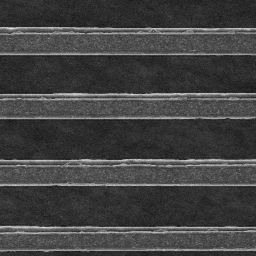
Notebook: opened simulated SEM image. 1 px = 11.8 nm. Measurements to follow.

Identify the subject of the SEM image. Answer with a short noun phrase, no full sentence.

lines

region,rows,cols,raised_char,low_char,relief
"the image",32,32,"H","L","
LLLLLLLLLLLLLLLLLLLLLLLLLLLLLLLL
LLLLLLLLLLLLLLLLLLLLLLLLLLLLLLLL
LLLLLLLLLLLLLLLLLLLLLLLLLLLLLLLL
HLHHHHHHHHLLLLLLLLLLLLLLLLLLLLLL
HHHHHHHHHHHHHHHHHHHHHHHHHHHHHHHH
HHHHHHHHHHHHHHHHHHHHHHHHHHHHHHHH
HHHHHHHHHHHHHHHHHHHHHHHHHHHHHHHH
LLLLLLLLLLLLLLLLLLLLLLLLLLLLLLLL
LLLLLLLLLLLLLLLLLLLLLLLLLLLLLLLL
LLLLLLLLLLLLLLLLLLLLLLLLLLLLLLLL
LLLLLLLLLLLLLLLLLLLLLLLLLLLLLLLL
LLLLLLLLLLLLLLLLLLLLLLLLLLLLLLLL
HHHHHHHHHHHHHHHHHHHHHHHHHHHHHHHH
HHHHHHHHHHHHHHHHHHHHHHHHHHHHHHHH
HHHHHHHHHHHHHHHHHHHHHHHHHHHHHHHH
LLLLLLLLLLLLLLLLLLLLLLLLLLLLLLLL
LLLLLLLLLLLLLLLLLLLLLLLLLLLLLLLL
LLLLLLLLLLLLLLLLLLLLLLLLLLLLLLLL
LLLLLLLLLLLLLLLLLLLLLLLLLLLLLLLL
LLLLLLLLLLLLLLLLLLLLLLLLLLLLLLLL
HHHHHHHHHHHHHHHHHHHHHHHHHHHHHHHH
HHHHHHHHHHHHHHHHHHHHHHHHHHHHHHHH
HHHHHHHHHHHHHHHHHHHHHHHHHHHHHHHH
LLLLLLLLLLLLLLLLLLLLLLLLLLLLLLLL
LLLLLLLLLLLLLLLLLLLLLLLLLLLLLLLL
LLLLLLLLLLLLLLLLLLLLLLLLLLLLLLLL
LLLLLLLLLLLLLLLLLLLLLLLLLLLLLLLL
LLLLLLLLLLLLLLLLLLLLLLLLLLLLLLLL
HHHHHHHHHHHHHHHHHHHHHHHHHHHHHHHH
HHHHHHHHHHHHHHHHHHHHHHHHHHHHHHHH
HHHHHHHHHHHHHHHHHHHHHHHHHHHHHHHH
LLLLLLLLLLLLLLLLLLLLLLLLLLLLLLLL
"